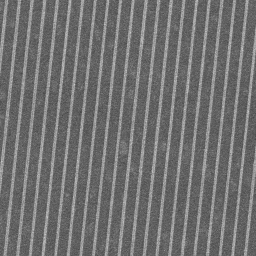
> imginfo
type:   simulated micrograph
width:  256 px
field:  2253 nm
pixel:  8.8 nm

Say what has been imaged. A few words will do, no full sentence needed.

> parallel lines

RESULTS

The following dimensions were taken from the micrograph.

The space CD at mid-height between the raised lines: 89.8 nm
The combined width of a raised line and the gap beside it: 111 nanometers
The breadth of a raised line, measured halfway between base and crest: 20.8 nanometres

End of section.